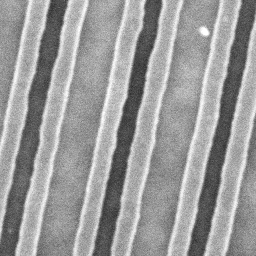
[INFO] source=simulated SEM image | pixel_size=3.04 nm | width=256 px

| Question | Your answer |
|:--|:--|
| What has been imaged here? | lines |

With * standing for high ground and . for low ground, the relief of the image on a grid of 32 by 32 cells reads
....**...**.....**..***.....**..
...***..***.....**..**.....***..
...***..**.....***..**.....***..
...***..**.....***..**.....**...
...**...**.....**...**.....**..*
...**..***....***..***....***..*
..***..***....***..**.....***..*
..***..**.....***..**.....***..*
..**...**.....**..***.....**...*
..**...**.....**..***.....**..**
..**..***.....**..***....***..**
.**...**.....***..**.....***..**
.**...**.....***..**.....***..**
.**...**.....**...**.....**...**
.**..***.....**..***.....**..***
.**..***.....**..***.....**..***
***..**.....***..**.....***..**.
***..**.....**...**.....***..**.
**...**.....**..***.....**..***.
**...**.....**..***.....**..***.
**..***.....**..***....***..***.
**..***....***..**.....***..**..
*...**.....**...**.....**...**..
*...**.....**..***.....**..***..
*..***.....**..***.....**..***..
*..***....***..**.....***..***..
*..**.....***..**.....***..**...
...**.....**...**.....**...**...
...**.....**..***.....**..***...
...**.....**..***....***..***...
..***....***..**.....***..**....
..**.....***..**.....**...**....